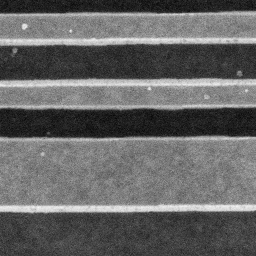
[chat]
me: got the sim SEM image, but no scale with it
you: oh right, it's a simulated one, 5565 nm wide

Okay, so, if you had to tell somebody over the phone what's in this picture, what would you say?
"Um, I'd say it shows lines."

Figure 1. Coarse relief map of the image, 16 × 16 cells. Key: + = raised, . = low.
................
++++++++++++++++
++++++++++++++..
................
................
++++++++++++++++
++++++++++++++++
................
................
++++++++++++++++
++++++++++++++++
++++++++++++++++
++++++++++++++++
................
................
................